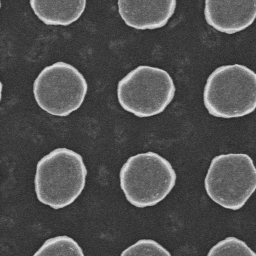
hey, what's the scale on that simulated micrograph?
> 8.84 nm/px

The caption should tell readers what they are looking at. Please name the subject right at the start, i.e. raised bodies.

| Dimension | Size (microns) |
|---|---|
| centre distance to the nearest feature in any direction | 0.763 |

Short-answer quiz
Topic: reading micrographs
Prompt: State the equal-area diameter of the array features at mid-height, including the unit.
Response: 458 nanometers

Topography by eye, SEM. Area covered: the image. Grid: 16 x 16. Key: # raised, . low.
..###..####..###
........##...###
................
................
...##...##....##
..###..####..###
..###...##...###
................
................
................
..###...###..###
..###...###..###
...##...##...##.
................
................
...##...##...###